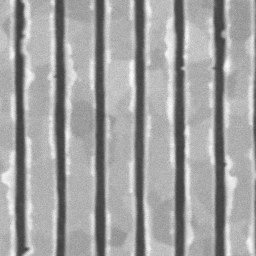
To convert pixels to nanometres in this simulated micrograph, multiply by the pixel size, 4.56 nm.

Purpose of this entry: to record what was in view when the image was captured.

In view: parallel lines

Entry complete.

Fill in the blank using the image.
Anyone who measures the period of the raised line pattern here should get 0.182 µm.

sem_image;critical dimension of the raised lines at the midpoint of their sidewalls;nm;131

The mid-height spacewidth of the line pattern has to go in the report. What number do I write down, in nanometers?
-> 51.9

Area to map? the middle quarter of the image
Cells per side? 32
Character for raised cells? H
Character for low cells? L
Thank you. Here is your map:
LHHHHHHLLLLHHHHHHLLLLHHHHHHLLLHH
LHHHHHHLLLLHHHHHHHLLLHHHHHHLLLHH
LHHHHHHLLLHHHHHHHHLLLHHHHHHLLLLH
LHHHHHHLLLHHHHHHHHLLLHHHHHHLLLHH
HHHHHHHLLLLHHHHHHHLLLHHHHHHLLLHH
HHHHHHHLLLLHHHHHHHLLLHHHHHHLLLHH
HHHHHHHHLLLHHHHHHHLLLHHHHHHLLLHH
LHHHHHHHLLLHHHHHHHLLLHHHHHHLLLHH
LHHHHHHHLLLHHHHHHHLLLHHHHHHLLLLH
HHHHHHHHLLLHHHHHHHLLLHHHHHHLLLLH
HHHHHHHHLLLHHHHHHLLLLHHHHHHLLLLH
LHHHHHHHLLLHHHHHHLLLLHHHHHHLLLLH
LHHHHHHHLLLHHHHHHLLLLHHHHHHLLLHH
LHHHHHHHLLLHHHHHHLLLLHHHHHHLLLHH
HHHHHHHHLLLHHHHHHLLLLHHHHHHLLLHH
HHHHHHHHLLLHHHHHHLLLLHHHHHHLLLHH
HHHHHHHHLLLHHHHHHLLLLHHHHHHLLLHH
HHHHHHHHLLLHHHHHHLLLHHHHHHHLLLHH
HHHHHHHHLLLHHHHHHLLLHHHHHHHLLLHH
HHHHHHHHLLLHHHHHHLLLLHHHHHHLLLHH
HHHHHHHHLLLHHHHHHLLLHHHHHHHHLLHH
HHHHHHHHLLHHHHHHHLLLHHHHHHHHLLHH
HHHHHHHHLLHHHHHHHLLLLHHHHHHHLLHH
HHHHHHHHLLHHHHHHHLLLLHHHHHHHLLHH
HHHHHHHHLLHHHHHHHLLLLHHHHHHHLLHH
HHHHHHHHLLLHHHHHHLLLHHHHHHHHLLHH
LHHHHHHHLLLHHHHHHLLLHHHHHHHHLLHH
LHHHHHHLLLLHHHHHHLLLHHHHHHHHLLLH
LHHHHHHLLLLHHHHHHLLLHHHHHHHLLLLH
LHHHHHHHLLLHHHHHHLLLHHHHHHHLLLLH
LHHHHHHHLLHHHHHHHLLLHHHHHHHLLLLH
LHHHHHHHLLHHHHHHHLLLHHHHHHHLLLLH